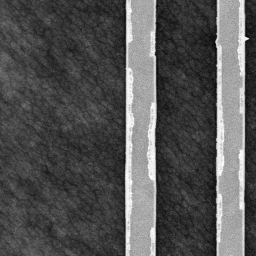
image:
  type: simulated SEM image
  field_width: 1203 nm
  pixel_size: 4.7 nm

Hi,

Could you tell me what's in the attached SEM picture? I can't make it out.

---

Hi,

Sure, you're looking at one or a few lines or trenches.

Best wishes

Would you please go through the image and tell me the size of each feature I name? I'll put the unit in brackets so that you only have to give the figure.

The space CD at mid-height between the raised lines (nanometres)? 294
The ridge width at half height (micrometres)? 0.128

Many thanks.